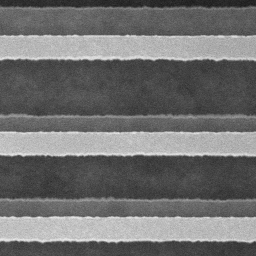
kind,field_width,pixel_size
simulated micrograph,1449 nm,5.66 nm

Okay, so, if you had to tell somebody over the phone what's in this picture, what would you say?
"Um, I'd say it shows lines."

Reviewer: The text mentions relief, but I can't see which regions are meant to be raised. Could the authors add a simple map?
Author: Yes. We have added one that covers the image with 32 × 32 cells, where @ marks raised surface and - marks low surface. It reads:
--------------------------------
@@@@@@@@@@@@@@@@@@@@@@@@@@@@@@@@
@@@@@@@@@@@@@@@@@@@@@@@@@@@@@@@@
@@@@@@@@@@@@@@@@@@@@@@@@@@@@@@@@
@@@@@@@@@@@@@@@@@@@@@@@@@@@@@@@@
@@@@@@@@@@@@@@@@@@@@@@@@@@@@@@@@
@@@@@@@@@@@@@@@@@@@@@@@@@@@@@@@@
----------------------@@-------@
--------------------------------
--------------------------------
--------------------------------
--------------------------------
--------------------------------
--------------------------------
--------------------------------
@@@@@@@@@@@@@@@@@@@@@@@@@@@@@@@@
@@@@@@@@@@@@@@@@@@@@@@@@@@@@@@@@
@@@@@@@@@@@@@@@@@@@@@@@@@@@@@@@@
@@@@@@@@@@@@@@@@@@@@@@@@@@@@@@@@
--------------------------------
--------------------------------
--------------------------------
--------------------------------
--------------------------------
--------------------------------
@@@@@@@@@@@@@@@@@@@@@@@@@@@@@@@@
@@@@@@@@@@@@@@@@@@@@@@@@@@@@@@@@
@@@@@@@@@@@@@@@@@@@@@@@@@@@@@@@@
@@@@@@@@@@@@@@@@@@@@@@@@@@@@@@@@
@@@@@@@@@@@@@@@@@@@@@@@@@@@@@@@@
--------------------------------
--------------------------------